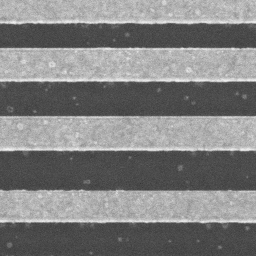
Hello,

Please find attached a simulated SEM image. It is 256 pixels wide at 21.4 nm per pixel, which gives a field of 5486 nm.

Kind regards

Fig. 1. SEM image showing lines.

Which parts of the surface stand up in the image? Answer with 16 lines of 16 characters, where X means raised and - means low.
XXXXXXXXXXXXXXXX
----------------
----------------
XXXXXXXXXXXXXXXX
XXXXXXXXXXXXXXXX
----------------
----------------
XXXXXXXXXXXXXXXX
XXXXXXXXXXXXXXXX
----------------
----------------
----------------
XXXXXXXXXXXXXXXX
XXXXXXXXXXXXXXXX
----------------
----------------